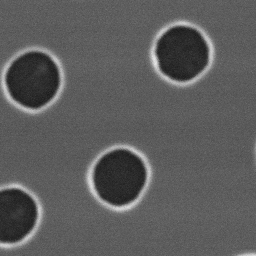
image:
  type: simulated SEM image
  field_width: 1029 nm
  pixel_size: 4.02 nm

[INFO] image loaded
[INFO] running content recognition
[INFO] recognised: holes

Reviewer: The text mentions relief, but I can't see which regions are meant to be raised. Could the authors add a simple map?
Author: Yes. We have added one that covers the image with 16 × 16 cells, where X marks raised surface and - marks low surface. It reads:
XXXXXXXXXXXXXXXX
XXXXXXXXXXXXXXXX
XXXXXXXXXX---XXX
X--XXXXXXX---XXX
----XXXXXX---XXX
----XXXXXXXXXXXX
X--XXXXXXXXXXXXX
XXXXXXXXXXXXXXXX
XXXXXXXXXXXXXXXX
XXXXXXX-XXXXXXXX
XXXXXX---XXXXXXX
XXXXXX---XXXXXXX
--XXXX--XXXXXXXX
--XXXXXXXXXXXXXX
--XXXXXXXXXXXXXX
XXXXXXXXXXXXXXXX